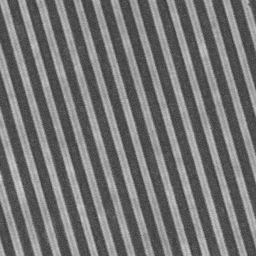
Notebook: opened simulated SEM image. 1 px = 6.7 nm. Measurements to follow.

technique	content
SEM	parallel lines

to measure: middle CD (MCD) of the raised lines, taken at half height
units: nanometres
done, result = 45.1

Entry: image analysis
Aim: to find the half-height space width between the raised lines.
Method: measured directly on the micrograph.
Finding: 78.2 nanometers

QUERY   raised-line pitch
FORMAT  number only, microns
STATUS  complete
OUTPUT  0.12